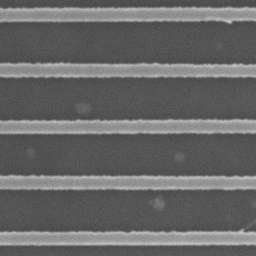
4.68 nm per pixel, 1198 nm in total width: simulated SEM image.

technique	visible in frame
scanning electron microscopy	lines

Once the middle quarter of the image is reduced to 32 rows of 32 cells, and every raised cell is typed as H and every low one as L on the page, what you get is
HHHHHHHHHHHHHHHHHHHHHHHHHHHHHHHH
HHHHHHHHHHHHHHHHHHHHHHHHHHHHHHHH
HHHHHHHHHHHHHHHHHHHHHHHHHHHHHHHH
LLLLLLLLLLLLLLLLLLLLLLLLLLLLLLLL
LLLLLLLLLLLLLLLLLLLLLLLLLLLLLLLL
LLLLLLLLLLLLLLLLLLLLLLLLLLLLLLLL
LLLLLLLLLLLLLLLLLLLLLLLLLLLLLLLL
LLLLLLLLLLLLLLLLLLLLLLLLLLLLLLLL
LLLLLLLLLLLLLLLLLLLLLLLLLLLLLLLL
LLLLLLLLLLLLLLLLLLLLLLLLLLLLLLLL
LLLLLLLLLLLLLLLLLLLLLLLLLLLLLLLL
LLLLLLLLLLLLLLLLLLLLLLLLLLLLLLLL
LLLLLLLLLLLLLLLLLLLLLLLLLLLLLLLL
LLLLLLLLLLLLLLLLLLLLLLLLLLLLLLLL
HHHHHHHHHHHHHHHHHHHHHHHHHHHHHHHH
HHHHHHHHHHHHHHHHHHHHHHHHHHHHHHHH
HHHHHHHHHHHHHHHHHHHHHHHHHHHHHHHH
LLLLLLLLLLLLLLLLLLLLLLLLLLLLLLLL
LLLLLLLLLLLLLLLLLLLLLLLLLLLLLLLL
LLLLLLLLLLLLLLLLLLLLLLLLLLLLLLLL
LLLLLLLLLLLLLLLLLLLLLLLLLLLLLLLL
LLLLLLLLLLLLLLLLLLLLLLLLLLLLLLLL
LLLLLLLLLLLLLLLLLLLLLLLLLLLLLLLL
LLLLLLLLLLLLLLLLLLLLLLLLLLLLLLLL
LLLLLLLLLLLLLLLLLLLLLLLLLLLLLLLL
LLLLLLLLLLLLLLLLLLLLLLLLLLLLLLLL
LLLLLLLLLLLLLLLLLLLLLLLLLLLLLLLL
LLLLLLLLLLLLLLLLLLLLLLLLLLLLLLLL
HHHHHHHHHHHHHHHHHHHHHHHHHHHHHHHH
HHHHHHHHHHHHHHHHHHHHHHHHHHHHHHHH
HHHHHHHHHHHHHHHHHHHHHHHHHHHHHHHH
LLLLLLLLLLLLLLLLLLLLLLLLLLLLLLLL